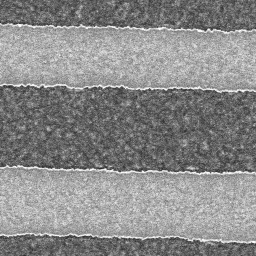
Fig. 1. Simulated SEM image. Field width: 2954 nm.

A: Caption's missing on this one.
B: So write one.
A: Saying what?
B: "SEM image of one or a few lines or trenches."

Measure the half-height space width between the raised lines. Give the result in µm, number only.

0.944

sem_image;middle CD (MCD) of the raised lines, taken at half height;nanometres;722